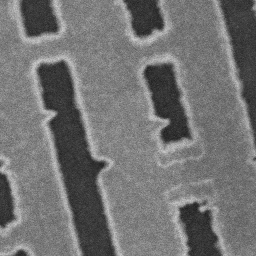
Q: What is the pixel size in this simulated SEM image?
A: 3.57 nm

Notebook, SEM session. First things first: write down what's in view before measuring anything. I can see one or a few lines or trenches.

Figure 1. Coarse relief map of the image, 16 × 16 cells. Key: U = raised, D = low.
UDDDUUUUDDUUUUDD
UDDDUUUUDDUUUUDD
UUUUUUUUUUUUUUDD
UUUUUUUUUUUUUUDD
UUDDDUUUUDDUUUUD
UUDDDUUUUDDUUUUD
UUUDDUUUUDDDUUUD
UUUDDUUUUUDDUUUD
UUUDDDUUUUDDUUUU
UUUDDDUUUUUUUUUU
UUUDDDDUUUUUUUUU
DUUUDDUUUUUUUUUU
DUUUDDDUUUUUUUUU
DUUUDDDUUUUDDUUU
UUUUUDDUUUUDDDUU
UUUUUDDUUUUUDDUU